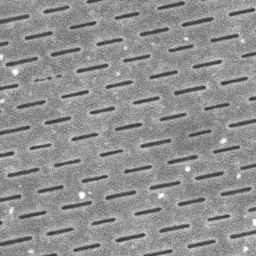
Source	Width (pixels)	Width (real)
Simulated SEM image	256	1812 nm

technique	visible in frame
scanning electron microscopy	a regular array of holes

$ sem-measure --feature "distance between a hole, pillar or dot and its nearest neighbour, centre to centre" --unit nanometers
219